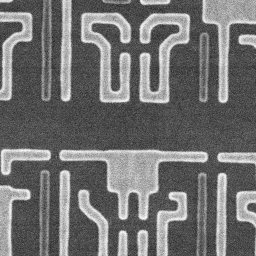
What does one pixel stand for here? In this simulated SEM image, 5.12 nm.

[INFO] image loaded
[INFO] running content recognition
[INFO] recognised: wiring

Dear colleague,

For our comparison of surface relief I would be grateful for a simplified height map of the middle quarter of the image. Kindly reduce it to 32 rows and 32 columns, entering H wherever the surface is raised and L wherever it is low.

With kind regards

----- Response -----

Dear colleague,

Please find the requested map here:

HHLLLLLLLHHHLLHHLLLHHLLLHHLLLLLL
HHLLLLLLLHHHLLHHLLLHHLLLHHLLLLLL
HHLLLLLLLHHHLLHHLLLHHLLLHHLLLLLL
HHLLLLLLLHHHLLHHLLLHHLLLHHLLLLLL
HHLLLLLLLHHHLLHHLLLHHLLLHHLLLLLL
HHLLLLLLLHHHLLHHLLLHHLLLHHLLLLLL
HHLLLLLLLHHHLLHHLLLHHHLLHHLLLLLL
HHLLLLLLLHHHHHHHLLLHHHHHHHLLLLLL
HLLLLLLLLHHHHHHHLLLHHHHHHHLLLLLL
LLLLLLLLLLLLLLLLLLLLLLLLLLLLLLLL
LLLLLLLLLLLLLLLLLLLLLLLLLLLLLLLL
LLLLLLLLLLLLLLLLLLLLLLLLLLLLLLLL
LLLLLLLLLLLLLLLLLLLLLLLLLLLLLLLL
LLLLLLLLLLLLLLLLLLLLLLLLLLLLLLLL
LLLLLLLLLLLLLLLLLLLLLLLLLLLLLLLL
LLLLLLLLLLLLLLLLLLLLLLLLLLLLLLLL
LLLLLLLLLLLLLLLLLLLLLLLLLLLLLLLL
LLLLLLLLLLLLLLLLLLLLLLLLLLLLLLLL
LLLLLLLLLLLLLLLLLLLLLLLLLLLLLLLL
LLLLLLLLLLLLLLLLLLLLLLLLLLLLLLLL
LLLLLLLLLLLLLLLLLLLLLLLLLLLLLLLL
LLLLLLLLLLLLLLLLLLLLLLLLLLLLLLLL
HHHHHHHHHHHHHHHHHHHHHHHHHHHHHHHH
HHHHHHHHHHHHHHHHHHHHHHHHHHHHHHHH
LLLLLLLLLLLHHHHHHHHHHHHHLLLLLLLL
LLLLLLLLLLLHHHHHHHHHHHHLLLLLLLLL
LLLLLLLLLLLHHHHHHHHHHHHLLLLLLLLL
HLLLLLLLLLLHHHHHHHHHHHHLLLLLLLLL
HLLLLLLLLLLHHHHHHHHHHHHLLLLLLLLL
HLLLLLLLLLLHHHHHHHHHHHHLLLLLLLLL
HLLLLLLLLLLHHHHHHHHHHHHLLLLLLLLL
HLLLLLLLLLLHHHHHHHHHHHHLLLLLLLLL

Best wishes